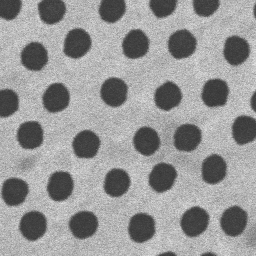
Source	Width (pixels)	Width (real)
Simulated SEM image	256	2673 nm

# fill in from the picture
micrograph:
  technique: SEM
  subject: a regular array of holes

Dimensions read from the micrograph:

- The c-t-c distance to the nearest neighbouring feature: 471 nm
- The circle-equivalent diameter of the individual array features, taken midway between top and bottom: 302 nanometers